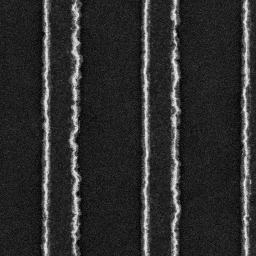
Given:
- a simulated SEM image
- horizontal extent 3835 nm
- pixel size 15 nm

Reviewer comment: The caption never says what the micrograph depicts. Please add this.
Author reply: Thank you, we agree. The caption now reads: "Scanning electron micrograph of one or a few lines or trenches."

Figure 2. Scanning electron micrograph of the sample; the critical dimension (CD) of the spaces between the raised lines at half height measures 1060 nm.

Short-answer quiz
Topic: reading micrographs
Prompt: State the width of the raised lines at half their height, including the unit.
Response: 0.433 micrometres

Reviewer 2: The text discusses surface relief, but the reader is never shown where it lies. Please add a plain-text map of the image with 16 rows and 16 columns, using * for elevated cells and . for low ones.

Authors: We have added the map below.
...**....**....*
...**....**....*
...**....**....*
...**....**....*
...**....**....*
...**....**....*
...**....**....*
...**....**....*
...**....**....*
...**....**....*
...**....**....*
...**....**....*
...**....**....*
...**....**....*
...**....**....*
...**....**....*